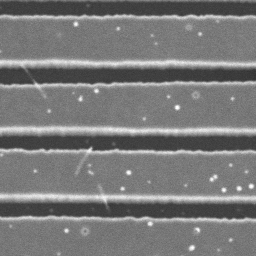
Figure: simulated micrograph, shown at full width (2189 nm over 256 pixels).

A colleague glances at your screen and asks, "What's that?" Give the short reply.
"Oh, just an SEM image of lines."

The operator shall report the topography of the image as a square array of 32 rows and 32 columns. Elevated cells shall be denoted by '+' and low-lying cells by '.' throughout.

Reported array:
................................
................................
++++++++++++++++++++++++++++++++
++++++++++++++++++++++++++++++++
++++++++++++++++++++++++++++++++
++++++++++++++++++++++++++++++++
++++++++++++++++++++++++++++++++
++++++++++++++++++++++++++++++++
................................
................................
....+..+.+..+.++++++++++++++++++
++++++++++++++++++++++++++++++++
++++++++++++++++++++++++++++++++
++++++++++++++++++++++++++++++++
++++++++++++++++++++++++++++++++
++++++++++++++++++++++++++++++++
++++++++++++++++++++++++++++++++
................................
................................
++++++++++++++++++++++++++++++++
++++++++++++++++++++++++++++++++
++++++++++++++++++++++++++++++++
++++++++++++++++++++++++++++++++
++++++++++++++++++++++++++++++++
++++++++++++++++++++++++++++++++
................................
................................
++++++++++++++++++++++++++++++++
++++++++++++++++++++++++++++++++
++++++++++++++++++++++++++++++++
++++++++++++++++++++++++++++++++
++++++++++++++++++++++++++++++++